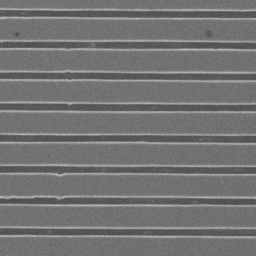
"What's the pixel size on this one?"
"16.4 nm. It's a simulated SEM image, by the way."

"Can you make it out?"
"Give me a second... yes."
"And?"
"parallel lines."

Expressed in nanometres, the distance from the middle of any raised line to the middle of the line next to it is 510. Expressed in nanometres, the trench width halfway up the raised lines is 123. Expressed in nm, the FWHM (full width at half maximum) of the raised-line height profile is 397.